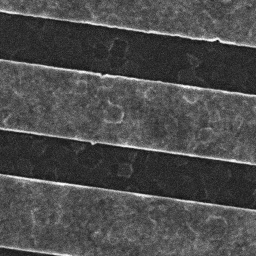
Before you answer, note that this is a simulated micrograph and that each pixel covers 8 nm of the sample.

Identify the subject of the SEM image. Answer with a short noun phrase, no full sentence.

one or a few lines or trenches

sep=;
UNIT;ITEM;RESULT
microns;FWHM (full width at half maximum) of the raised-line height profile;0.552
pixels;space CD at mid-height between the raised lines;46.1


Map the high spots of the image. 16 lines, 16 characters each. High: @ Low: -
@@@@@@@@@@@@@@@@
------@@@@@@@@@@
-------------@@@
----------------
@@@@@@----------
@@@@@@@@@@@@@---
@@@@@@@@@@@@@@@@
@@@@@@@@@@@@@@@@
---@@@@@@@@@@@@@
-----------@@@@@
----------------
@@@@------------
@@@@@@@@@@@-----
@@@@@@@@@@@@@@@@
@@@@@@@@@@@@@@@@
-@@@@@@@@@@@@@@@